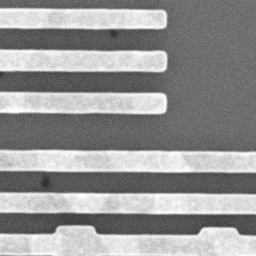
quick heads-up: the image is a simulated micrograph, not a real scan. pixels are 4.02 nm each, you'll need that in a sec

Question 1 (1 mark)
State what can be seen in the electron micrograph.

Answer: wiring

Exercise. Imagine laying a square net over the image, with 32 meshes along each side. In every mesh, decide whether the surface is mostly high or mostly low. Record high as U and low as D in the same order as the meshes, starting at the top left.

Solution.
DDDDDDDDDDDDDDDDDDDDDDDDDDDDDDDD
UUUUUUUUUUUUUUUUUUUUDDDDDDDDDDDD
UUUUUUUUUUUUUUUUUUUUUDDDDDDDDDDD
DDDDDDDDDDDUUDDDDDDDDDDDDDDDDDDD
DDDDDDDDDDDDDDDDDDDDDDDDDDDDDDDD
DDDDDDDDDDDDDDDDDDDDDDDDDDDDDDDD
UUUUUUUUUUUUUDUUUUDUDDDDDDDDDDDD
UUUUUUUUUUUUUUUUUUUUUDDDDDDDDDDD
UUUUUUUUUUUUUUUUUUUUUDDDDDDDDDDD
DDDDDDDDDDDDDDDDDDDDDDDDDDDDDDDD
DDDDDDDDDDDDDDDDDDDDDDDDDDDDDDDD
DDDDDDDDDDDDDDDDDDDDDDDDDDDDDDDD
UUUUUUUUUUUUUUUUUUUUUDDDDDDDDDDD
UUUUUUUUUUUUUUUUUUUUUDDDDDDDDDDD
DDDDDDDDDDDDDDDDDDDDDDDDDDDDDDDD
DDDDDDDDDDDDDDDDDDDDDDDDDDDDDDDD
DDDDDDDDDDDDDDDDDDDDDDDDDDDDDDDD
DDDDDDDDDDDDDDDDDDDDDDDDDDDDDDDD
DDDDDDDDDDDDDDDDDDDDDDDDDDDDDDDD
UUUUUUUUUUUUUUUUUUUUUUUUUUUUUUUU
UUUUUUUUUUUUUUUUUUUUUUUUUUUUUUUU
DDDDDDDDDDDDDDDDDDDDDDDDDDDDDDDD
DDDDDDDDDDDDDDDDDDDDDDDDDDDDDDDD
DDDDDDDDDDDDDDDDDDDDDDDDDDDDDDDD
UUUUUUUUUUUUUUUUUUUUUUUUUUUUUUUU
UUUUUUUUUUUUUUUUUUUUUUUUUUUUUUUU
DDDUUUUUDUUUUUUUUUUUUUUUUUUUUUUU
DDDDDDDDDDDDDDDDDDDDDDDDDDDDDDDD
DDDDDDDUUUUUDDDDDDDDDDDDDDDDDDDD
UUUUUUUUUUUUUUUDDUUDDDDDUUUUUUDD
UUUUUUUUUUUUUUUUUUUUUUUUUUUUUUUU
UUUUUUUUUUUUUUUUUUUUUUUUUUUUUUUU